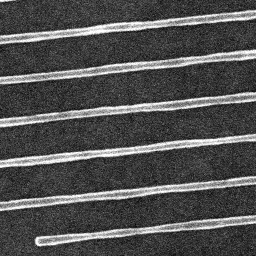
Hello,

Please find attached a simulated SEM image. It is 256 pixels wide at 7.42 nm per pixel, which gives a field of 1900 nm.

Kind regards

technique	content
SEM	parallel lines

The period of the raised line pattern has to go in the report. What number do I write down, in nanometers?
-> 303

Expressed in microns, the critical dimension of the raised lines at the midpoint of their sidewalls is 0.0433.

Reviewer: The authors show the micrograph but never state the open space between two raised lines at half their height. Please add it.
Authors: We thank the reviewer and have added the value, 256 nanometres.